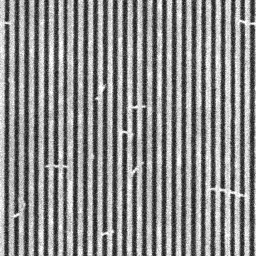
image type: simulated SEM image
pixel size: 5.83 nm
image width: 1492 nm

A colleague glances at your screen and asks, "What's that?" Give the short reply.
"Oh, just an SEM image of parallel lines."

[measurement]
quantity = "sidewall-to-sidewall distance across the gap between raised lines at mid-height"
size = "31.3 nanometres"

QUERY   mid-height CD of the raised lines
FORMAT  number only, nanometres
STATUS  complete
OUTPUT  26.2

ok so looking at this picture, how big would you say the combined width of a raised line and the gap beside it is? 0.0572 µm